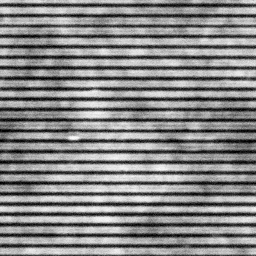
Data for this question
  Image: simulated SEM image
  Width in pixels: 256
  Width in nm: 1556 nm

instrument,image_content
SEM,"parallel lines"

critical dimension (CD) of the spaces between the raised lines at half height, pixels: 4.75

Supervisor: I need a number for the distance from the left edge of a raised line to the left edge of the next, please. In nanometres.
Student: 63.5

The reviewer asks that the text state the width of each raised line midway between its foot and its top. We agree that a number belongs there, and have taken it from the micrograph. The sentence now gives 0.035 microns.